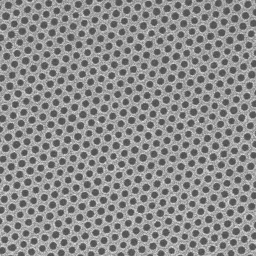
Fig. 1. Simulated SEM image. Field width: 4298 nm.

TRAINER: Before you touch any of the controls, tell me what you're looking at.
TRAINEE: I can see a regular array of holes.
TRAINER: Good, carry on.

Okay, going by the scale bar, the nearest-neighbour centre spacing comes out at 183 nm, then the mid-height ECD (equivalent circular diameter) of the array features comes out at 124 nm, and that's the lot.